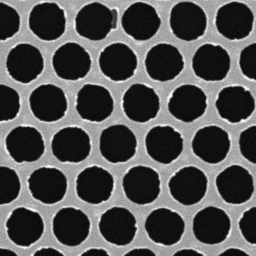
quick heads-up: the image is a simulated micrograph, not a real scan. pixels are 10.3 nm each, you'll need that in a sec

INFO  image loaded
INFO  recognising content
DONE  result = a regular array of holes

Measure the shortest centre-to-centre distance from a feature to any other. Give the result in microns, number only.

0.477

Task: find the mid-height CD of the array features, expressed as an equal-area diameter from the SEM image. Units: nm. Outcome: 392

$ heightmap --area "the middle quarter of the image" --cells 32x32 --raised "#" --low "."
.......##.........##..........##
......###.........###.........##
......####........###........###
.....######.....######......####
########################.#######
#####.....#######....########...
####.......#####......######....
###........####........####.....
###.........###.........##......
.##.........###.........##......
.##.........###.........##......
.##.........###.........##......
####........###........####.....
#####......#####.......#####....
########.#########..##########..
############...########.########
.....#####.......####.......####
......###.........###........###
......###.........##..........##
.......##.........##..........##
.......##.........##..........##
.......##.........###.........##
......###.........###........###
......####.......#####......####
##..########...#########...#####
###################.############
#####.....######......#######...
####........###........#####....
###.........###.........###.....
.##.........###.........##......
.##.........###.........##......
.##.........###.........##......